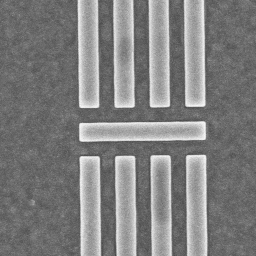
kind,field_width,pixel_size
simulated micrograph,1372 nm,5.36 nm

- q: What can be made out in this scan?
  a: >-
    groups of lines, slits or small figures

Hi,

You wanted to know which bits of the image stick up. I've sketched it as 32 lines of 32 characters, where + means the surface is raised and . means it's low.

..........++..+++..++..++.......
..........++..+++..++..++.......
..........++..+++..++..++.......
..........++..+++..++..++.......
..........++..+++..++..++.......
..........++..+++..++..++.......
..........++..+++..++..++.......
..........++..+++..++..+++......
..........++..+++..++..+++......
..........++..+++..++..+++......
..........++..+++..++..+++......
..........++..+++..++..+++......
..........++..+++..++..+++......
................................
................................
..........++++++++++++++++......
..........++++++++++++++++......
..........+++++++++++...........
................................
...................++...+.......
..........++..+++..++..+++......
..........++...++..++..+++......
..........++...++..++..+++......
..........++...++..++..+++......
..........++...++..++..+++......
..........++...++..++..+++......
..........++...++..++..+++......
..........++...++..++..+++......
..........++...++..++..+++......
..........++...++..++..+++......
..........++...++..++..+++......
..........++...++..++..+++......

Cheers